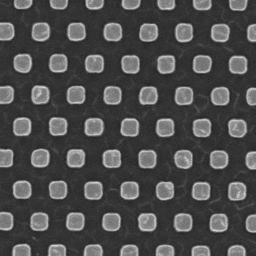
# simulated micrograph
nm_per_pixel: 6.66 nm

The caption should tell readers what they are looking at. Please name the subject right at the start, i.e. a regular array of raised bodies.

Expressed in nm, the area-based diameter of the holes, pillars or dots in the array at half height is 126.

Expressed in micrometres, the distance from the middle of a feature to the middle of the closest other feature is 0.238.